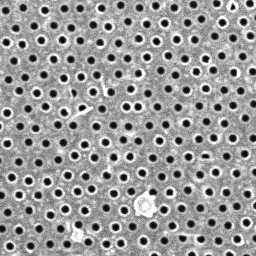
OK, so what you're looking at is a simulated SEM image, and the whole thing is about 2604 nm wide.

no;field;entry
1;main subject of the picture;a regular array of holes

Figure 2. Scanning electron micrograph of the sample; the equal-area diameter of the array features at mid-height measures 82.7 nm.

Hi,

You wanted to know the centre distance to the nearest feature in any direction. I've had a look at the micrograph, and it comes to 170 nm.